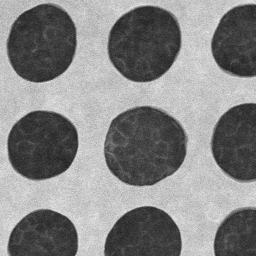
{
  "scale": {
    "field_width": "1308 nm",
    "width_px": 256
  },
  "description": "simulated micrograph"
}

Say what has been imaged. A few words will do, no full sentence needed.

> holes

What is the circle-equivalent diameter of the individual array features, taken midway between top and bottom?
0.379 microns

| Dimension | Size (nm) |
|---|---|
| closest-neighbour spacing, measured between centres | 522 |